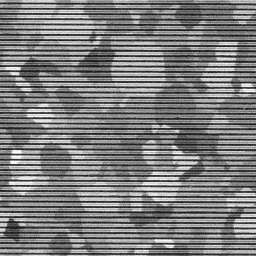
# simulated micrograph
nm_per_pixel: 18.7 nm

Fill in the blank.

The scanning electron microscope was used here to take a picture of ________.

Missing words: parallel lines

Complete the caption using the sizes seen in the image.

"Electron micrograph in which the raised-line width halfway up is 49 nm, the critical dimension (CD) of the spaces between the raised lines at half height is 49 nanometers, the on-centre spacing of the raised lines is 97.3 nanometres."